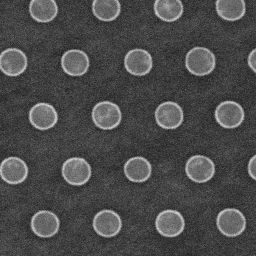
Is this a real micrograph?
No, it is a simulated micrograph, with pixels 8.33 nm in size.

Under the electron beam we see a regular array of raised bodies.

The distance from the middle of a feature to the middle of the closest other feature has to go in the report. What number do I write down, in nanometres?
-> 509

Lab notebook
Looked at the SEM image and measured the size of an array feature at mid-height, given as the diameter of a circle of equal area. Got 219 nm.